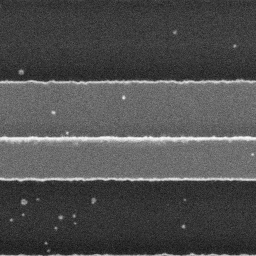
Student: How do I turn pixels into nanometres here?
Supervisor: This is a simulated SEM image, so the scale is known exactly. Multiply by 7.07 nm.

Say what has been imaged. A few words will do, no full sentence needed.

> lines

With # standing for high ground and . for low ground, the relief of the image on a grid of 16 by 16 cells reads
................
................
................
................
................
################
################
################
################
################
################
................
................
................
................
................